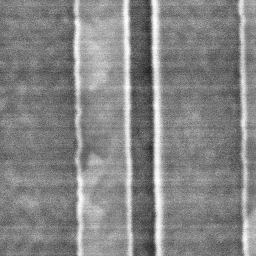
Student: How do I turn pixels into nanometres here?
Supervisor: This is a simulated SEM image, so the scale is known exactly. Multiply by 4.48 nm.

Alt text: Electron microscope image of lines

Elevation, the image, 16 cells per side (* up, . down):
.....***.......*
.....***.......*
.....***.......*
.....***.......*
.....***.......*
.....***.......*
.....***.......*
.....***.......*
.....***.......*
.....***.......*
.....***.......*
.....***.......*
.....***.......*
.....***.......*
.....***.......*
.....***.......*